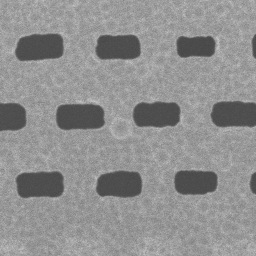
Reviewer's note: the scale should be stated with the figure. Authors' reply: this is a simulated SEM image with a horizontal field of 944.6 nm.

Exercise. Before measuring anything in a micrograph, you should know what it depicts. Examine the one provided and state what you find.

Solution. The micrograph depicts a regular array of holes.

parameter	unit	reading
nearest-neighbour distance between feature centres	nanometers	285